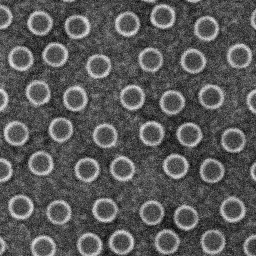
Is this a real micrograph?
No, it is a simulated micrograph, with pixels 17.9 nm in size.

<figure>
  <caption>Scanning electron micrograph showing a regular array of raised bodies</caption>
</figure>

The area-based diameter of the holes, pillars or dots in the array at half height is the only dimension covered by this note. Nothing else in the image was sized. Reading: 0.412 micrometres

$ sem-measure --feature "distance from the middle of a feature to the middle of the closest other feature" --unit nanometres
649